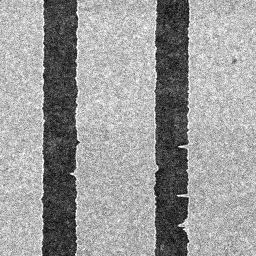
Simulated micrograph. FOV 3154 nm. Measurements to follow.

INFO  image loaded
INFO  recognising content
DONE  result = one or a few lines or trenches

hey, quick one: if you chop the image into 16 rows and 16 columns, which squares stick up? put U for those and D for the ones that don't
UUUDDUUUUUDDUUUU
UUUDDUUUUUDDUUUU
UUUDDUUUUUDDUUUU
UUUDDUUUUUDDUUUU
UUUDDUUUUUDDUUUU
UUUDDUUUUUDDUUUU
UUUDDUUUUUDDUUUU
UUUDDUUUUUDDUUUU
UUUDDUUUUUDDUUUU
UUUDDUUUUUDDUUUU
UUUDDUUUUUDDUUUU
UUUDDUUUUUDDUUUU
UUUDDUUUUUDDUUUU
UUUDDUUUUUDDUUUU
UUUDDUUUUUDDUUUU
UUUDDUUUUUDDUUUU